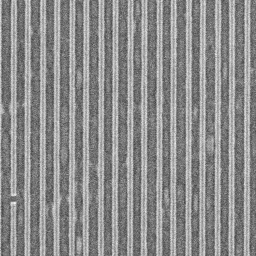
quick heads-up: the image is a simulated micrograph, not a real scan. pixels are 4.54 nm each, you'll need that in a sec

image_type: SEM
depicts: parallel lines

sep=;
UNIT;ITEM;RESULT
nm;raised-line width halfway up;17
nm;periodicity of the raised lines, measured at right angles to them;66.2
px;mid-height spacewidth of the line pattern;11.2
